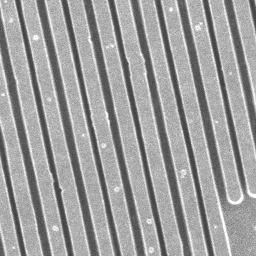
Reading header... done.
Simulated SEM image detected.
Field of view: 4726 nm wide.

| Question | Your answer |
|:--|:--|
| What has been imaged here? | parallel lines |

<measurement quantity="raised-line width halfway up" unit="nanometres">296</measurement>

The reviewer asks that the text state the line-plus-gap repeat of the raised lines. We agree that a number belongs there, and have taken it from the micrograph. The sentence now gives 422 nm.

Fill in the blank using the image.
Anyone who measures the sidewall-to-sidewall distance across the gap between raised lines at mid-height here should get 6.24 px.